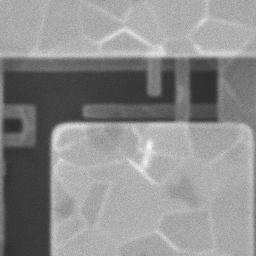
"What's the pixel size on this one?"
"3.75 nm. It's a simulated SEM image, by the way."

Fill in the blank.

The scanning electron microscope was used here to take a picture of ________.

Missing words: wiring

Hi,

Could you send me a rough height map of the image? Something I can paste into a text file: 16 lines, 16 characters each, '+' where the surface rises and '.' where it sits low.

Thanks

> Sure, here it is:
++++++++++++++++
++++++++++++++++
++++++++++++++++
++++++++++++++++
................
................
................
................
...+++++++++++++
...+++++++++++++
...+++++++++++++
...+++++++++++++
...+++++++++++++
...+++++++++++++
...+++++++++++++
...+++++++++++++